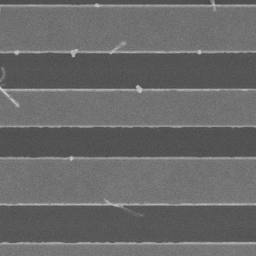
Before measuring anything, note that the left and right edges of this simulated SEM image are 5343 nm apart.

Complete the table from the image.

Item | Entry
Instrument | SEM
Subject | lines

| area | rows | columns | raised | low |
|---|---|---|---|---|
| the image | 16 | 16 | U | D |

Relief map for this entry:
UUUUUUUUUUUUUUUU
UUUUUUUUUUUUUUUU
UUUUUUUUUUUUUUUU
DDDDDDDDDDDDDDDD
DDDDDDDDDDDDDDDD
DDDDDDDDDDDDDDDD
UUUUUUUUUUUUUUUU
UUUUUUUUUUUUUUUU
DDDDDDDDDDDDDDDD
DDDDDDDDDDDDDDDD
UUUUUUUUUUUUUUUU
UUUUUUUUUUUUUUUU
UUUUUUUUUUUUUUUU
DDDDDDDDDDDDDDDD
DDDDDDDDDDDDDDDD
UUUUUUUUUUUUUUUU